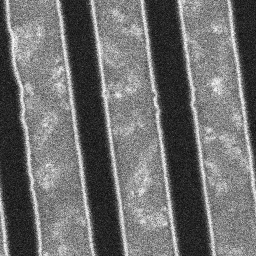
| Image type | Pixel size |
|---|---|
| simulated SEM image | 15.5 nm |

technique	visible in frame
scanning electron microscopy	one or a few lines or trenches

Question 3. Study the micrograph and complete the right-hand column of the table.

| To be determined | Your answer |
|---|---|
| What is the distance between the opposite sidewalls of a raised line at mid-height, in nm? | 546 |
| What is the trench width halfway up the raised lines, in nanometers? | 756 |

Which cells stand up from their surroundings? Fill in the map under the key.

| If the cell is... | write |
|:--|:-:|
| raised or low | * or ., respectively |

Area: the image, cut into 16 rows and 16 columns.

*...**...**...**
*...**...**...**
*...**...***...*
*...**...***...*
*...**...***...*
*...**....**...*
*...***...**...*
**...**...**...*
**...**...**...*
**...**...***...
**...**...***...
**...**...***...
**...***...**...
**...***...**...
**....**...**...
***...**...**...